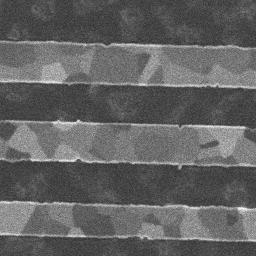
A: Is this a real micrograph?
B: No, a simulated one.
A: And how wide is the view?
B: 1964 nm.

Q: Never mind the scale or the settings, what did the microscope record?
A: one or a few lines or trenches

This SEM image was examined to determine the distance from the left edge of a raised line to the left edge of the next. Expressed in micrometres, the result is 0.601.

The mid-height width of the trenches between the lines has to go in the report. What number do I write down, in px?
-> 40.8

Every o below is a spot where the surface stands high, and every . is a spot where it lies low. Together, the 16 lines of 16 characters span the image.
................
................
o...............
oooooooooooooooo
oooooooooooooooo
................
................
................
oooooooooooooooo
oooooooooooooooo
................
................
................
oooooooooooooooo
oooooooooooooooo
................